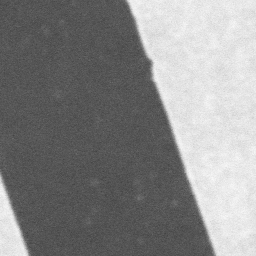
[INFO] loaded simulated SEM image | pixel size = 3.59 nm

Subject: one or a few lines or trenches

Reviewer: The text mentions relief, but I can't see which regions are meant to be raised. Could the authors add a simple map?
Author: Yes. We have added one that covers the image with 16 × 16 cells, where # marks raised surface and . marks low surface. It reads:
........########
.........#######
.........#######
.........#######
..........######
..........######
..........######
...........#####
...........#####
...........#####
............####
............####
............####
#............###
#............###
##...........###